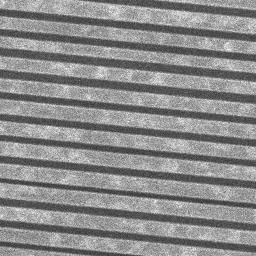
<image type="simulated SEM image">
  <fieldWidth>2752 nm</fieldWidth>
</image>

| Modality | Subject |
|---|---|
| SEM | parallel lines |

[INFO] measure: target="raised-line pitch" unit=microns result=0.227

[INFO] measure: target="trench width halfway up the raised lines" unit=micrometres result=0.0815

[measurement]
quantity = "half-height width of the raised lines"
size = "146 nm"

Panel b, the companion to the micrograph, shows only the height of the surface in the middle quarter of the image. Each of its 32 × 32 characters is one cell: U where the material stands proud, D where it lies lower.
UUUUUUDDDDDDDDDDDDDDDDDDDDDDDDDU
UUUUUUUUUUUUUUUUDDDDDDDDDDDDDDDD
UUUUUUUUUUUUUUUUUUUUUUUUUUDDDDDD
DDDDDDUUUUUUUUUUUUUUUUUUUUUUUUUU
DDDDDDDDDDDDDDDDUUUUUUUUUUUUUUUU
UDDDDDDDDDDDDDDDDDDDDDDDDDUUUUUU
UUUUUUUUUUUDDDDDDDDDDDDDDDDDDDDD
UUUUUUUUUUUUUUUUUUUUUDDDDDDDDDDD
DUUUUUUUUUUUUUUUUUUUUUUUUUUUUUUD
DDDDDDDDDDDUUUUUUUUUUUUUUUUUUUUU
DDDDDDDDDDDDDDDDDDDDDUUUUUUUUUUU
UUUUUUUUUUDDDDDDDDDDDDDDDDDDDDDU
UUUUUUUUUUUUUUUUUUUUDDDDDDDDDDDD
UUUUUUUUUUUUUUUUUUUUUUUUUUUUUUDD
DDDDDDUUUUUUUUUUUUUUUUUUUUUUUUUU
DDDDDDDDDDDDDDDDUUUUUUUUUUUUUUUU
UUUUUDDDDDDDDDDDDDDDDDDDDDUUUUUU
UUUUUUUUUUUUUUUDDDDDDDDDDDDDDDDD
UUUUUUUUUUUUUUUUUUUUUUUUUDDDDDDD
DDDUUUUUUUUUUUUUUUUUUUUUUUUUUUUU
DDDDDDDDDDDDDUUUUUUUUUUUUUUUUUUU
UUUUDDDDDDDDDDDDDDDDDDDUUUUUUUUU
UUUUUUUUUUUUUUDDDDDDDDDDDDDDDDDD
UUUUUUUUUUUUUUUUUUUUUUUUDDDDDDDD
DDUUUUUUUUUUUUUUUUUUUUUUUUUUUUUU
DDDDDDDDDDDDUUUUUUUUUUUUUUUUUUUU
DDDDDDDDDDDDDDDDDDDDDDUUUUUUUUUU
UUUUUUUUUDDDDDDDDDDDDDDDDDDDDDDU
UUUUUUUUUUUUUUUUUUUDDDDDDDDDDDDD
UUUUUUUUUUUUUUUUUUUUUUUUUUUUUDDD
DDDDDUUUUUUUUUUUUUUUUUUUUUUUUUUU
DDDDDDDDDDDDDDUUUUUUUUUUUUUUUUUU